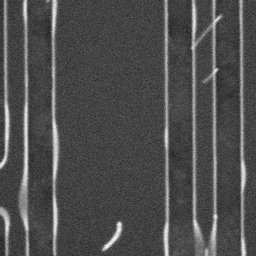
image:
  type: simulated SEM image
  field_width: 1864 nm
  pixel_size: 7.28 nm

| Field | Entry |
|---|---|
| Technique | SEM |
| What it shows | groups of lines, slits or small figures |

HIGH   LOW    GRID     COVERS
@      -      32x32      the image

-@@----@@@@@@@@@@@@@@---@@@---@@
-@@----@@@@@@@@@@@@@@---@@@---@@
-@@----@@@@@@@@@@@@@@---@@@---@@
-@@----@@@@@@@@@@@@@@---@@@---@@
-@@----@@@@@@@@@@@@@@---@@@---@@
-@@----@@@@@@@@@@@@@@---@@@---@@
-@@----@@@@@@@@@@@@@@---@@@---@@
-@@----@@@@@@@@@@@@@@---@@@---@@
-@@----@@@@@@@@@@@@@@---@@@---@@
-@@----@@@@@@@@@@@@@@---@@@---@@
-@@----@@@@@@@@@@@@@@---@@@---@@
-@@----@@@@@@@@@@@@@@---@@@---@@
-@@----@@@@@@@@@@@@@@---@@@---@@
-@@----@@@@@@@@@@@@@@---@@@---@@
-@@----@@@@@@@@@@@@@@---@@@---@@
-@@----@@@@@@@@@@@@@@---@@@---@@
-@@----@@@@@@@@@@@@@@---@@@---@@
-@@----@@@@@@@@@@@@@@---@@@---@@
-@@----@@@@@@@@@@@@@@---@@@---@@
-@@----@@@@@@@@@@@@@@---@@@---@@
@@@----@@@@@@@@@@@@@@---@@@---@@
@@@----@@@@@@@@@@@@@@---@@@---@@
@@@----@@@@@@@@@@@@@@---@@@---@@
@@@----@@@@@@@@@@@@@@---@@@---@@
@@@----@@@@@@@@@@@@@@---@@@---@@
@@@----@@@@@@@@@@@@@@---@@@---@@
@@@----@@@@@@@@@@@@@@---@@@---@@
-@@----@@@@@@@@@@@@@@---@@@---@@
-@@----@@@@@@@@@@@@@@----@@---@@
-@@----@@@@@@@@@@@@@@----@@---@@
-@@----@@@@@@@@@@@@@@----@@---@@
-@@----@@@@@@@@@@@@@@----@@---@@